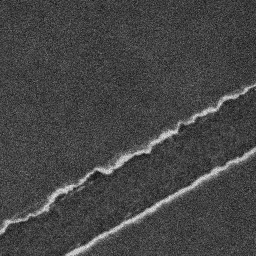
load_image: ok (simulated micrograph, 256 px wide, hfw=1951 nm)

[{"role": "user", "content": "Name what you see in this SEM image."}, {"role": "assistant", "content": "one or a few lines or trenches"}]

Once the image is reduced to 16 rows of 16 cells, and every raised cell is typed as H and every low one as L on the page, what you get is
HHHHHHHHHHHHHHHH
HHHHHHHHHHHHHHHH
HHHHHHHHHHHHHHHH
HHHHHHHHHHHHHHHH
HHHHHHHHHHHHHHHH
HHHHHHHHHHHHHHHH
HHHHHHHHHHHHHHLL
HHHHHHHHHHHHLLLL
HHHHHHHHHHLLLLLL
HHHHHHHHHLLLLLLL
HHHHHHHLLLLLLLHH
HHHHHLLLLLLLHHHH
HHHLLLLLLLHHHHHH
HHLLLLLLLHHHHHHH
LLLLLLLHHHHHHHHH
LLLLLHHHHHHHHHHH